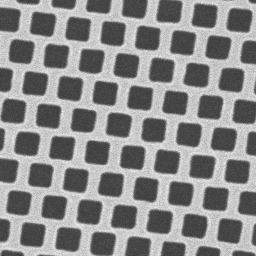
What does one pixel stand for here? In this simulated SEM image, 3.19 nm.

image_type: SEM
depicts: a regular array of holes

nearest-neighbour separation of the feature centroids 110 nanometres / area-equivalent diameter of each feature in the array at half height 84.5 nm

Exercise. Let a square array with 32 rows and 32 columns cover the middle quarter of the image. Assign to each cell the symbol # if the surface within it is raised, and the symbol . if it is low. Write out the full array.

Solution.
.###......###......###......##..
####.....###......###.......##..
############......###......###..
....############.####......###..
.....###.....###########...###..
.....##.......###..############.
.....##.......##......##########
....###......###......###......#
....###......###......###......#
#######......###......###......#
################......###......#
##.....############..###.......#
##......###.....###########...##
##......###......###...#########
##......###......###......###..#
##......###......###......##....
##.....###.......##.......##....
###########.....###......###....
..#################......###....
...###.....##########....###....
...##.......###....###########..
...##.......##......####..######
..###......###......###......###
..###......###......###......###
#####......###......###......###
##############......###......##.
......############.####......##.
......###.....###########...###.
......###......###....##########
......###......###......###..###
......###......###......##......
......##.......##.......##......